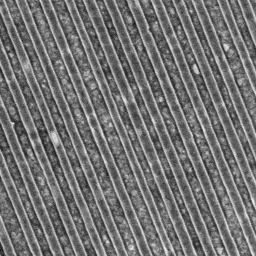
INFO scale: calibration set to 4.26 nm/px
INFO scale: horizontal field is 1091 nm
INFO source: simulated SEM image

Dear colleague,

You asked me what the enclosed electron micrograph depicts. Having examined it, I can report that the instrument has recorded parallel lines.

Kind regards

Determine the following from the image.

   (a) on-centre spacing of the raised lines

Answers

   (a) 0.0874 micrometres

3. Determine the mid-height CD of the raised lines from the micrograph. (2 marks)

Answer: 42.5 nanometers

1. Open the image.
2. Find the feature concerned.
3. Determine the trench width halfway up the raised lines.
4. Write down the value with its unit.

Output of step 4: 0.0425 microns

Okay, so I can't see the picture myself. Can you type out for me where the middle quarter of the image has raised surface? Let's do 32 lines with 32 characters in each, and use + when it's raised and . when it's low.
+++....++..+++...++...+++...+++.
.++....++...+++..+++...++....++.
.+++....++..+++..+++...+++...+++
..++....++...+++..++....++....++
..+++...+++..+++..+++...+++...++
..+++....++..+++...++...+++...++
...++....++...+++..+++...++....+
...+++....++..+++..+++...+++...+
....++....++....++..++...+++....
+...+++...+++..+++..+++...+++...
+...+++....++..+++...++...+++...
+....++....++...+++..+++...++...
++...+++....++..+++..+++...+++..
++....++....++...+++..++....++..
+++...+++...+++..+++..+++...+++.
.++...+++....++..+++...++...+++.
.++....++....++...+++..+++...++.
.+++...+++....++..+++..+++...+++
..++....++....++...+++..++...+++
..+++...+++...+++..+++..+++...++
..+++...+++....++..+++...++...++
...++....++....++...+++..+++...+
...+++...+++....++..+++..+++...+
+...++....++....++...+++..++...+
+...+++...+++...+++..+++..+++...
++..+++...+++....++..+++...++...
++...++....++....++...+++..+++..
++...+++...+++....++..+++..+++..
.++...++....++....++...+++..++..
.++...+++...+++...+++..+++..+++.
.+++...++...+++....++..+++...++.
..++...++....++....++...+++..+++